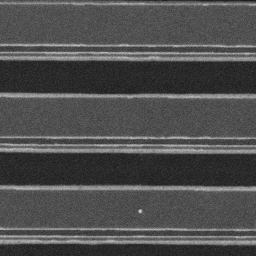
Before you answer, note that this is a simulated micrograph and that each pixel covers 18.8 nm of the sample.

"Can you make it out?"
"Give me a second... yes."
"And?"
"lines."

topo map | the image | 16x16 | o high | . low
oooooooooooooooo
oooooooooooooooo
oooooooooooooooo
oooooooooooooooo
................
................
oooooooooooooooo
oooooooooooooooo
oooooooooooooooo
................
................
................
oooooooooooooooo
oooooooooooooooo
oooooooooooooooo
................